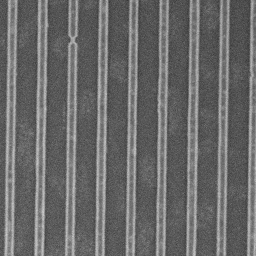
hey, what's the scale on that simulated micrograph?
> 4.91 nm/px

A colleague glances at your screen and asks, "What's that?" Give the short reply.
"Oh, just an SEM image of parallel lines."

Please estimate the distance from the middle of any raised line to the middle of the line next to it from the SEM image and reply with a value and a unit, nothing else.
30.3 px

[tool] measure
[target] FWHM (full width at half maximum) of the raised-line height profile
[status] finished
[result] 32.5 nm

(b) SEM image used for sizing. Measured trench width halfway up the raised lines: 115 nm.